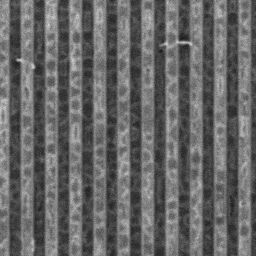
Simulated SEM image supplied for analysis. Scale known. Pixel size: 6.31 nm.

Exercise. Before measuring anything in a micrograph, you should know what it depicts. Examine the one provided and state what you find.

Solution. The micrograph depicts parallel lines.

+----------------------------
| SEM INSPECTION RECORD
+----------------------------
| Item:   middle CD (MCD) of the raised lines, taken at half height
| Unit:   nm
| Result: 68.6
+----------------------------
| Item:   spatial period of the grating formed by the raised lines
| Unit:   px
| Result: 24.2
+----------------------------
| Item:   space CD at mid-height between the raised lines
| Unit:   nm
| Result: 80.4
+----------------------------